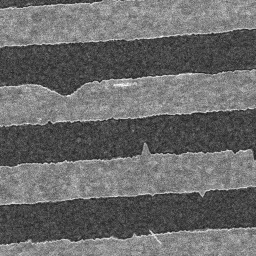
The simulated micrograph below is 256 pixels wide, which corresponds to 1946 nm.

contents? one or a few lines or trenches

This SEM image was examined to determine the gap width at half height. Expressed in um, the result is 0.303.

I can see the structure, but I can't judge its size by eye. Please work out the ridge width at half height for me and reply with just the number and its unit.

291 nanometres